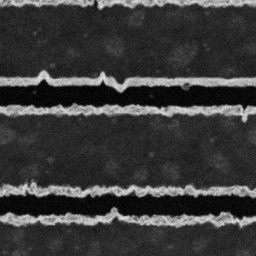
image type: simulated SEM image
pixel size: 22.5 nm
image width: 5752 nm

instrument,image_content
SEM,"one or a few lines or trenches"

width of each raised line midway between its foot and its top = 666 nanometres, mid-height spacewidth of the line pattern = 1790 nm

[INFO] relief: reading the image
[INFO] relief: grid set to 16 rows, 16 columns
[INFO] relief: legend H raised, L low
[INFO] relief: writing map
LLLLLLLLLLLLLLLL
LLLLLLLLLLLLLLLL
LLLLLLLLLLLLLLLL
LLLLLLLLLLLLLLLL
LLLLLLLLLLLLLLLL
HHHHHHHHHHHHHHHH
HHHHHHHHHHHHHHHH
LLLLLLLLLLLLLLLL
LLLLLLLLLLLLLLLL
LLLLLLLLLLLLLLLL
LLLLLLLLLLLLLLLL
LLLLLLLLLLLLLLLL
HHHHHHHHHHHHHHHH
HHHHHHHHHHHHHHHH
LLLLLLLLLLLLLLLL
LLLLLLLLLLLLLLLL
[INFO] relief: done